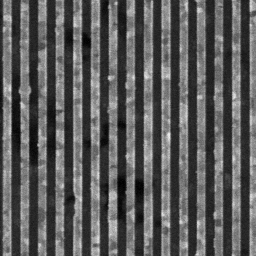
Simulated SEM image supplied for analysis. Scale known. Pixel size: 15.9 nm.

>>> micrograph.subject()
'parallel lines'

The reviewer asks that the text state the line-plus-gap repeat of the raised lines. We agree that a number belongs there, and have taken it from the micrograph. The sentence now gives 280 nm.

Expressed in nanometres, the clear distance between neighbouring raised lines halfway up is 155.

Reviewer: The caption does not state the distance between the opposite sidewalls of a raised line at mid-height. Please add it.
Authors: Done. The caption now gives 7.75 pixels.